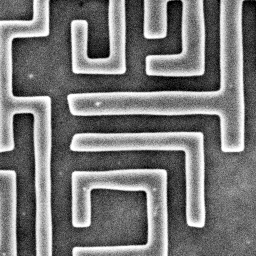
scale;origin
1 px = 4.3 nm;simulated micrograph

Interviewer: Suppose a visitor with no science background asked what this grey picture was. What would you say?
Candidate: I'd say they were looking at wiring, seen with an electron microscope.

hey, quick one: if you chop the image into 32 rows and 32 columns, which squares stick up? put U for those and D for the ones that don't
DDDDUUDDDDDDDDUUDDUUUDDUUDDDUUDD
DDDDUUDDDDDDDDUUDDUUUDDUUDDDUUDD
DDDDUUDDDDDDDDUUDDUUUDDUUDDDUUDD
UUUUUUDDDUUDDDUUDDUUUDDUUDDDUUDD
UUUUUDDDDUUDDDUUDDUUUDDUUUDDUUDD
UDDDDDDDDUUDDDUUDDDDDDDUUDDDUUDD
UDDDDDDDDUUDDDUUDDDDDDDUUDDDUUDD
UDDDDDDDDUUUUUUUDDUUUUUUUDDDUUDD
UDDDDDDDDUUUUUUUDDUUUUUUUDDDUUDD
UDDDDDDDDDDDDDDDDDDDDDDDDDDDUUDD
UDDDDDDDDDDDDDDDDDDDDDDDDDDDUUDD
UUDDDDDDDDDDDDDDDDDDDDDDDDDUUUDD
UUUUUUDDDUUUUUUUUUUUUUUUUUUUUUDD
UUUUUUDDDUUUUUUUUUUUUUUUUUUUUUDD
UUDDUUDDDDDDDDDDDDDDDDDDDDDUUUDD
UUDDUUDDDDDDDDDDDDDDDDDDDDDDUUDD
UUDDUUDDDDDDDDDDDDDDDDDDDDDDUUDD
UUDDUUDDDUUUUUUUUUUUUUUUUDDDUUDD
UUDDUUDDDUUUUUUUUUUUUUUUUDDDUUDD
DDDDUUDDDDDDDDDDDDDDDDDUUDDDDDDD
DDDDUUDDDDDDDDDDDDDDDDDUUDDDDDDD
UUDDUUDDDDDDDUUUUUUUUDDUUDDDDDDD
UUDDUUDDDUUUUUUUUUUUUDDUUDDDDDDD
UUDDUUDDDUUUDUUUUUUUUDDUUDDDDDDD
UUDDDUDDDUUDDDDDDDUUUDDUUDDDDDDD
UUDDDUDDDUUDDDDDDDUUUDDUUDDDDDDD
UUDDDUDDDUUDDDDDDDDUUDDUUUDDDDDD
UUDDDUDDDUUDDDDDDDDUUDDUUUDDDDDD
UUDDDUDDDDDDDDDDDDDUUDDDDDDDDDDD
UUDDDUDDDDDDDDDDDDDUUDDDDDDDDDDD
UUDDDUDDDDDDDDDDDDUUUDDDDDDDDDDD
UUDDDUDDDUUUUUUUUUUUUDDDDDDDDDDD